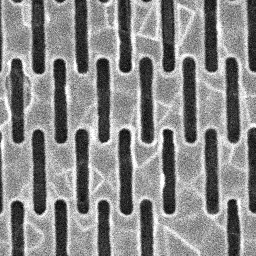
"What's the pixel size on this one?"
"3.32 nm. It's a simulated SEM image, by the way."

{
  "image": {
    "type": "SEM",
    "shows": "a regular array of holes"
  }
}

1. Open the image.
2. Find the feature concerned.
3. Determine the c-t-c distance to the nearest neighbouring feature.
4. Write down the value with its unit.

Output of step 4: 142 nanometres